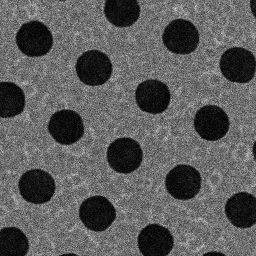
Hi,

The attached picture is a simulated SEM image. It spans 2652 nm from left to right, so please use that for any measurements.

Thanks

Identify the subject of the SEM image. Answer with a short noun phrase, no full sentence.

a regular array of holes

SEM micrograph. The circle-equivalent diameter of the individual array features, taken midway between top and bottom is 0.377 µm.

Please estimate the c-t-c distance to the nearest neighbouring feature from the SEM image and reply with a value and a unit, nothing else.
670 nm